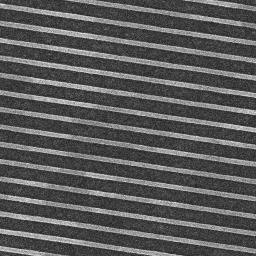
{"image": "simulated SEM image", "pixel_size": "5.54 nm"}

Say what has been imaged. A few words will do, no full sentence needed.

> parallel lines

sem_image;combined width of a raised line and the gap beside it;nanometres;94.9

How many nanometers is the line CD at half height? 21.2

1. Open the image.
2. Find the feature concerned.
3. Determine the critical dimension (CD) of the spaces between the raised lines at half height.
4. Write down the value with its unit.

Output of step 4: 74 nm